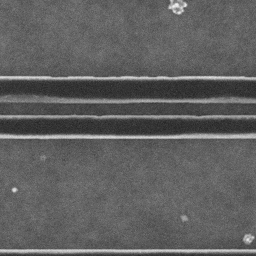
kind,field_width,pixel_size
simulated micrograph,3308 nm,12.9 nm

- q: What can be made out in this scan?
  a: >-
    lines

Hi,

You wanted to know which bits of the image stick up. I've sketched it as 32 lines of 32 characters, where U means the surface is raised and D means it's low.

DDDDDDDDDDDDDDDDDDDDDDDDDDDDDDDD
DDDDDDDDDDDDDDDDDDDDDDDDDDDDDDDD
DDDDDDDDDDDDDDDDDDDDDDDDDDDDDDDD
DDDDDDDDDDDDDDDDDDDDDDDDDDDDDDDD
DDDDDDDDDDDDDDDDDDDDDDDDDDDDDDDD
DDDDDDDDDDDDDDDDDDDDDDDDDDDDDDDD
DDDDDDDDDDDDDDDDDDDDDDDDDDDDDDDD
DDDDDDDDDDDDDDDDDDDDDDDDDDDDDDDD
DDDDDDDDDDDDDDDDDDDDDDDDDDDDDDDD
DDDDDDDDDDDDDDDDDDDDDDDDDDDDDDDD
UUUUUUUUUUUUUUUUUUUUUUUUUUUUUUUU
UUUUUUUUUUUUUUUUUUUUUUUUUUUUUUUU
DDDDDDUUUUUUUUUUUUUUUUUUUUUUUUUU
DDDDDDDDDDDDDDDDDDDDDDDDDDDDDDDD
DDDDDDDDDDDDDDDDDDDDDDDDDDDDDDDD
UUUUUUUUUUUUUUUUUUUUUUUUUUUUUUUU
UUUUUUUUUUUUUUUUUUUUUUUUUUUUUUUU
DDDDDDDDDDDDDDDDDDDDDDDDDDDDDDDD
DDDDDDDDDDDDDDDDDDDDDDDDDDDDDDDD
DDDDDDDDDDDDDDDDDDDDDDDDDDDDDDDD
DDDDDDDDDDDDDDDDDDDDDDDDDDDDDDDD
DDDDDDDDDDDDDDDDDDDDDDDDDDDDDDDD
DDDDDDDDDDDDDDDDDDDDDDDDDDDDDDDD
DDDDDDDDDDDDDDDDDDDDDDDDDDDDDDDD
DDDDDDDDDDDDDDDDDDDDDDDDDDDDDDDD
DDDDDDDDDDDDDDDDDDDDDDDDDDDDDDDD
DDDDDDDDDDDDDDDDDDDDDDDDDDDDDDDD
DDDDDDDDDDDDDDDDDDDDDDDDDDDDDDDD
DDDDDDDDDDDDDDDDDDDDDDDDDDDDDDDD
DDDDDDDDDDDDDDDDDDDDDDDDDDDDDDDD
DDDDDDDDDDDDDDDDDDDDDDDDDDDDDDDD
UUUUUUUUUUUUUUUUUUUUUUUUUUUUUUUU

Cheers